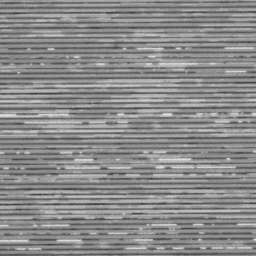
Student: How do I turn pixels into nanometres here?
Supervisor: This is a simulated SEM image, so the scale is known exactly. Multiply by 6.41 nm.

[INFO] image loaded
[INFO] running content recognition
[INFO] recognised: parallel lines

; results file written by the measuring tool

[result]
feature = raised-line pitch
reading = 32.3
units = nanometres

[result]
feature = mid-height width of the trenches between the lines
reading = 11.2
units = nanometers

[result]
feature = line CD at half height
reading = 22.4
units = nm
